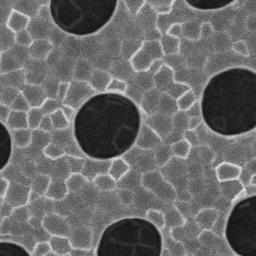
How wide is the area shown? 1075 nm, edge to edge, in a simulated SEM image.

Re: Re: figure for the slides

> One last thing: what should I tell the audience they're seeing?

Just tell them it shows holes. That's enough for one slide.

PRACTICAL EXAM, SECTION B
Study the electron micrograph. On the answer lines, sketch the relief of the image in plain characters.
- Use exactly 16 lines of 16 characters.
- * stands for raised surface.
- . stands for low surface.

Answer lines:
***....*****..**
****...*********
****************
****************
**************..
*************...
*****...*****...
*****....****...
.****....*******
.****...********
****************
****************
***************.
**************..
*******...****..
.*****....*****.